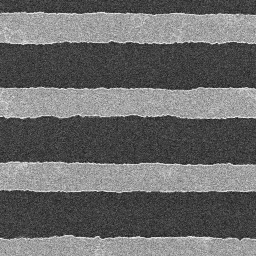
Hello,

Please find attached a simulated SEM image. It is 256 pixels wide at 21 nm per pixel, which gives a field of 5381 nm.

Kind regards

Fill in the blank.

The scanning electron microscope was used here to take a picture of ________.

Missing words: one or a few lines or trenches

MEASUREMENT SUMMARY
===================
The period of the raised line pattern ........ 1570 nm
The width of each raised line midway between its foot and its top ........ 594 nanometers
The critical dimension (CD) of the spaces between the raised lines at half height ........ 980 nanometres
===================